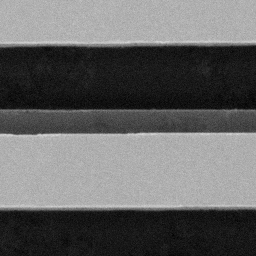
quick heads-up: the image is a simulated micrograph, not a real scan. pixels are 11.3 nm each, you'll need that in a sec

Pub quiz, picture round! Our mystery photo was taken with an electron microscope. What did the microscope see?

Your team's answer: lines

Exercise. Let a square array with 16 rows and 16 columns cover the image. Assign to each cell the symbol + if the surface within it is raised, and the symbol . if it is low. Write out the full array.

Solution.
++++++++++++++++
++++++++++++++++
++++++++++++++++
................
................
................
................
++++++++++++++++
++++++++++++++++
++++++++++++++++
++++++++++++++++
++++++++++++++++
++++++++++++++++
................
................
................